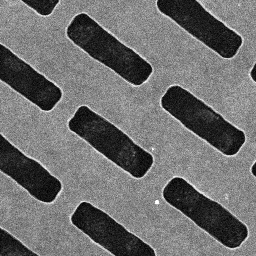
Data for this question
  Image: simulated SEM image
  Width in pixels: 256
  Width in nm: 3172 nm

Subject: holes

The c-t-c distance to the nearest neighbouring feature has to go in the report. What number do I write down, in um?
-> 1.14